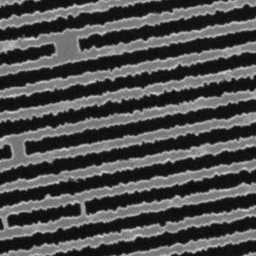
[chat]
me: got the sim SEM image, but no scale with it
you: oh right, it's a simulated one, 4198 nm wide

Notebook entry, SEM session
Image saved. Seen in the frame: parallel lines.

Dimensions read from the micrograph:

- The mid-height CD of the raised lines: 141 nm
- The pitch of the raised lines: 378 nm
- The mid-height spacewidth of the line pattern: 230 nm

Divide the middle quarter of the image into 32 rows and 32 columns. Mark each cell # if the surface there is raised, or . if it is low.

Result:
................############....
.............##########.........
.....#############..............
.#########.##.................##
#######...................######
#.....................##########
..............###########.#.#...
..........############.#........
......###########.#.............
##########......................
######....................######
#...................############
................##########......
...........##########...........
....############................
###########...................##
#####...................########
#...................##########..
...............###########......
..........#########.#...........
....############................
###########....................#
#####...................########
....................##########..
.............############.......
.........###########............
....##########..................
#########...................####
###....................#########
...................###########..
.............##############.....
.......#############............